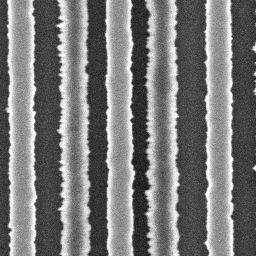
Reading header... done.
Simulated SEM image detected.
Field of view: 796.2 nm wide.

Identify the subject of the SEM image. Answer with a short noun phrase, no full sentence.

lines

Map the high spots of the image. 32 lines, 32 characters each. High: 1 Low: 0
01110000111001110001110000111000
01110000111001110001110000111000
01110000111001110001110000111000
01110000111001110001110000111000
01110000111001110001110000111000
01110000110001110001110000111000
01110000111001110001110000111000
01110000111001110001110000111000
01110000110001110001110000111000
01110000111001110001110000111000
01110000111001110001110000111000
01110000111001110001110000111000
01110000110001110001110000111000
01110000111001110001110000111000
01110000111001110001110000111000
01110000111001110001110000111000
01110000111001110001110000111000
01110000111000110001110000111000
01110000111000111001110000111000
01110000111001110001110000111000
01110000111001110001110000111000
01110000111000111001110000111000
01110000111000111001110000111000
01110000111001111001110000111000
01111000111001110001110000111000
01110000111001110001110000111000
01110000111001111001110000111000
01110000111001111001110000111000
01110000111001111001110000111000
01110000111000110001110000111000
01110000111001110001110000111000
01110000111000111001110000111000